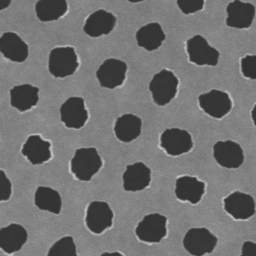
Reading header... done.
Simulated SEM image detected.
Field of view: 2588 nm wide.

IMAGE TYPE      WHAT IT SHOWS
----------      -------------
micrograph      a regular array of holes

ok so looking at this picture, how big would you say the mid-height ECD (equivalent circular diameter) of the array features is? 292 nanometres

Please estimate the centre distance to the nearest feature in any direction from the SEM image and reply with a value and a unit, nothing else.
520 nm